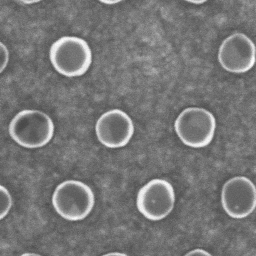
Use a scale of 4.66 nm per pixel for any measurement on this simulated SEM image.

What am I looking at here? raised bodies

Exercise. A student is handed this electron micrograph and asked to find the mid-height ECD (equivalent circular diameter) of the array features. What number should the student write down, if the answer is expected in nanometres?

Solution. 174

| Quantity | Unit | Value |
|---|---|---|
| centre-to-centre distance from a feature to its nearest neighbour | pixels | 81.5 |